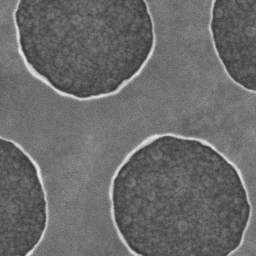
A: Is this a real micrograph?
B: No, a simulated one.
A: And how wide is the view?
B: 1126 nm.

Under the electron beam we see holes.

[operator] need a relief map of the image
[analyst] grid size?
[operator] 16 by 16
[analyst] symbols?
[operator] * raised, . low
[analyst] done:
*........****...
*........****...
*.........***...
**.......*****..
**......******..
***....********.
****************
****************
**********.*****
.*******......**
..******.......*
...****........*
...****........*
...****.........
...****........*
..******.......*